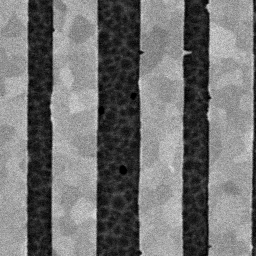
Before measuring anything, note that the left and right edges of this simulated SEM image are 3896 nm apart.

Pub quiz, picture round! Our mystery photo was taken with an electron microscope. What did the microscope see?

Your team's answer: one or a few lines or trenches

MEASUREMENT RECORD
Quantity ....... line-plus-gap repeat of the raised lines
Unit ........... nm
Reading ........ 1190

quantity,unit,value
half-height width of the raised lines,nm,660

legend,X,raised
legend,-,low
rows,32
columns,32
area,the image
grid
XXX----XXXXX------XXXXX---XXXXXX
XXX----XXXXX------XXXXX---XXXXXX
XXX----XXXXX------XXXXX---XXXXXX
XXX----XXXXX------XXXXX---XXXXXX
XXX----XXXXX------XXXXX---XXXXXX
XXX----XXXXX------XXXXX---XXXXXX
XXX----XXXXX------XXXXX---XXXXXX
XXX----XXXXX------XXXXX---XXXXXX
XXX----XXXXX------XXXXX---XXXXXX
XXX----XXXXX------XXXXX---XXXXXX
XXX----XXXXX-----XXXXXX---XXXXXX
XXX----XXXXX-----XXXXXX---XXXXXX
XXX---XXXXXX------XXXXX---XXXXXX
XXX---XXXXXX------XXXXX---XXXXXX
XXX---XXXXXX------XXXXX---XXXXXX
XXX----XXXXX------XXXXX---XXXXXX
XXX----XXXXX------XXXXX---XXXXXX
XXX----XXXXX------XXXXX---XXXXXX
XXX----XXXXX------XXXXX---XXXXX-
XXX----XXXXX------XXXXX---XXXXX-
XXX----XXXXX------XXXXX---XXXXX-
XXX----XXXXX------XXXXX---XXXXX-
XXX----XXXXX-----XXXXXX---XXXXXX
XXX---XXXXXX-----XXXXXX---XXXXXX
XXX----XXXXX-----XXXXXX---XXXXX-
XXX----XXXXX--X--XXXXXX---XXXXX-
XXX----XXXXX-----XXXXXX---XXXXX-
XXX----XXXXX-----XXXXXX---XXXXX-
XXX----XXXXX------XXXXX---XXXXX-
XXX----XXXXX------XXXXX---XXXXX-
XXX----XXXXX------XXXXX---XXXXX-
XXX----XXXXX------XXXXX---XXXXXX